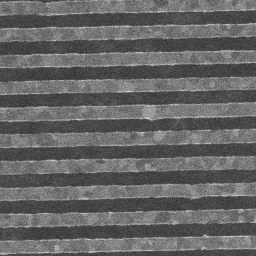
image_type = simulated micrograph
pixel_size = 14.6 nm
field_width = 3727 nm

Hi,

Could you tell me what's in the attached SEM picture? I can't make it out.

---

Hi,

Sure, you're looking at parallel lines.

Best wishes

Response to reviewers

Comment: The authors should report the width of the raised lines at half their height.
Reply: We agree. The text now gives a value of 182 nm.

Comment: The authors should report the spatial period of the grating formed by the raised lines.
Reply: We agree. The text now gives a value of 0.386 micrometres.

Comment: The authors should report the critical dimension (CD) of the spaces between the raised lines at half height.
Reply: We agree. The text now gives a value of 206 nanometres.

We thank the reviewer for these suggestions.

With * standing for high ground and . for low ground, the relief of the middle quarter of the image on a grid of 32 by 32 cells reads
****............................
................................
................................
................................
********************************
********************************
****************************.***
................................
................................
................................
......**.......*****************
********************************
********************************
********************.***........
................................
................................
................................
********************************
********************************
********************************
*.*.............................
................................
................................
............................**..
********************************
********************************
***************************.....
................................
................................
................................
...........***..****************
********************************